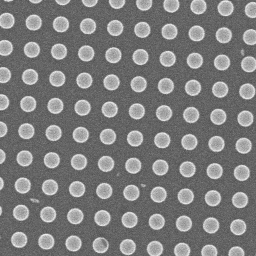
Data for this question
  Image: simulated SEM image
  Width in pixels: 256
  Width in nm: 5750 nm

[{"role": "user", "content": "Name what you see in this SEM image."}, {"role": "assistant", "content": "an array of small figures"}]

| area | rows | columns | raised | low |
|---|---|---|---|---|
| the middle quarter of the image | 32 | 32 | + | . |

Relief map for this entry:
.........................++....+
................................
....++..........................
...++++...+++.....++............
...++++...++++...+++....+++....+
....++....++++...+++....+++...++
.................+++....+++...++
...............................+
................................
...+++..........................
...+++....+++....+++....++......
...+++....+++...++++...++++...++
....++....+++...++++...++++...++
.................++.....++....++
...............................+
................................
...+++....++....................
..++++...++++...+++....+++......
...+++...++++...++++...+++....++
....+.....++....+++....+++...+++
.......................+++....++
................................
................................
..+++....+++....................
..++++...+++....+++....++.......
..+++....+++...++++...++++...+++
.........+++....+++...++++...+++
.......................++....+++
................................
...+............................
..+++....+++....++..............
.++++...++++...++++...+++....+++